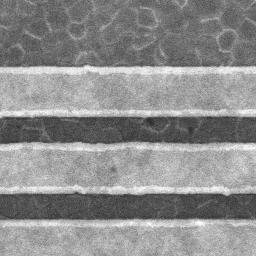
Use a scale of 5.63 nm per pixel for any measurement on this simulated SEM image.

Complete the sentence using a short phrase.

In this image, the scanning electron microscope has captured one or a few lines or trenches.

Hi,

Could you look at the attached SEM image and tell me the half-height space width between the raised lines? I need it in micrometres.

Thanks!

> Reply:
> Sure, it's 0.171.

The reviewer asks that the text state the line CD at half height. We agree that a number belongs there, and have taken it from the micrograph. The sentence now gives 256 nm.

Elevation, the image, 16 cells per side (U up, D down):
DDDDDDDDDDDDDDDD
DDDDDDDDDDDDDDDD
DDDDDDDDDDDDDDDD
DDDDDDDDDDDDDDDD
UUUUUUUUUUUUUUUU
UUUUUUUUUUUUUUUU
UUUUUUUUUUUUUUUU
DDDDDDDDDDDDDDDD
DDDDDDDDDDDDDDDD
UUUUUUUUUUUUUUUU
UUUUUUUUUUUUUUUU
UUUUUUUUUUUUUUUU
DDDDDDDDDDDDDDDD
DDDDDDDDDDDDDDDD
UUUUUUUUUUUUUUUU
UUUUUUUUUUUUUUUU